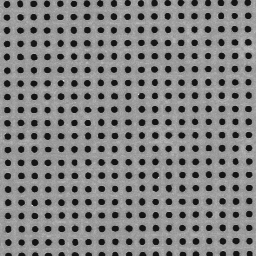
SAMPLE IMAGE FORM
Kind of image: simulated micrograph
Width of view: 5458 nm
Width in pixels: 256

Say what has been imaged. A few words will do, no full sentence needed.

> a regular array of holes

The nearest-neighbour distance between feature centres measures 0.278 microns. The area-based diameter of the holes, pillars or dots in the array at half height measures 140 nanometres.